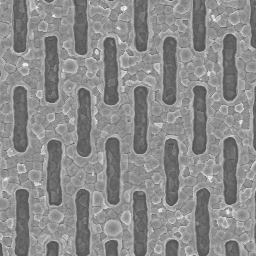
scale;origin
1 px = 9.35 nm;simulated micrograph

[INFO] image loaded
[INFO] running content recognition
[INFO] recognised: a regular array of holes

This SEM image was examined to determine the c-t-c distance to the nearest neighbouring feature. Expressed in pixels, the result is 57.1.